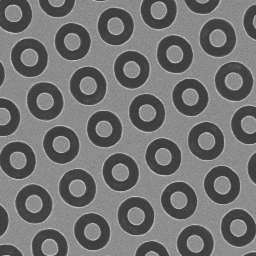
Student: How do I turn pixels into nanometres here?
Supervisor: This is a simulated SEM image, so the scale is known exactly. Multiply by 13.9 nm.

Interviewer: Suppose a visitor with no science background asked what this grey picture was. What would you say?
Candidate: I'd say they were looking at a regular array of ring-shaped grooves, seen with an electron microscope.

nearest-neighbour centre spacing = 0.638 um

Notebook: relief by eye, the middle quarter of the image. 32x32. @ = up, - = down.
@@@@@@@@@@@@@--@@@@--@@@-------@
@@@-----@@@@---@@@@--@@@@------@
@@--------@@@--@@@@--@@@@@@@@@@@
@@---@@---@@@--------@@@@@@@@@@@
@---@@@@--@@@@------@@@@@@@@@---
@---@@@@---@@@@----@@@@@@@@@----
@---@@@@---@@@@@@@@@@@@@@@@---@@
@@---@@---@@@@@@@@@@-@@@@@@---@@
@@@-------@@@@@@@@-----@@@@---@@
@@@@-----@@@@@@@@-------@@@---@@
@@@@@@@@@@@@@@@@---@@@---@@@----
@@@@@@@@@@@@@@@@---@@@@--@@@----
@@@@@@@------@@@---@@@@--@@@@@--
@@@@@@--------@@@--@@@---@@@@@@@
@@@@@@---@@---@@@--------@@@@@@@
@@@@@@--@@@@---@@@------@@@@@@@@
--@@@@--@@@@--@@@@@----@@@@@@@@@
---@@@--@@@@--@@@@@@@@@@@@@@@@@-
@--@@@--------@@@@@@@@@@@@@@@@@-
@---@@@------@@@@@@@@@-----@@@@-
@---@@@@----@@@@@@@@@-------@@@-
@---@@@@@@@@@@@@@@@@@---@@---@@-
---@@@@@@@@@@--@@@@@---@@@@--@@@
---@@@@@@@@------@@@---@@@@--@@@
-@@@@@@@@@--------@@@--@@@---@@@
@@@@@@@@@@---@@---@@@--------@@@
@@---@@@@@--@@@@---@@@------@@@@
------@@@@--@@@@---@@@@@---@@@@@
-------@@@---@@@---@@@@@@@@@@@@@
--@@@---@@--------@@@@@@@@@@--@@
-@@@@---@@@------@@@@@@@@@-----@
-@@@@---@@@@----@@@@@@@@@-------